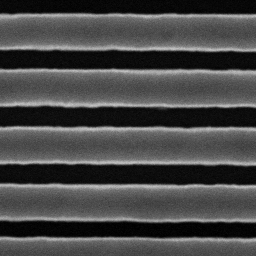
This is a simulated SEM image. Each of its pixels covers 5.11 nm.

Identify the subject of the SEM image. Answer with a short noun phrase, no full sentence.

lines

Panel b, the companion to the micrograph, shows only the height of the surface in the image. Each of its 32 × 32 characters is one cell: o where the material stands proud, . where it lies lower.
................................
................................
oooooooooooooooooooooooooooooooo
oooooooooooooooooooooooooooooooo
oooooooooooooooooooooooooooooooo
oooooooooooooooooooooooooooooooo
................................
................................
................................
oooooooooooooooooooooooooooooooo
oooooooooooooooooooooooooooooooo
oooooooooooooooooooooooooooooooo
oooooooooooooooooooooooooooooooo
................................
................................
................................
oooooooooooooooooooooooooooooooo
oooooooooooooooooooooooooooooooo
oooooooooooooooooooooooooooooooo
oooooooooooooooooooooooooooooooo
o.oo....oo.ooooooooooooooooooooo
................................
................................
oooooooooooooooooooooooooooooooo
oooooooooooooooooooooooooooooooo
oooooooooooooooooooooooooooooooo
oooooooooooooooooooooooooooooooo
oooooooooooooooooooooooooooooooo
................................
................................
oooooooooooooooooooooooooooooooo
oooooooooooooooooooooooooooooooo